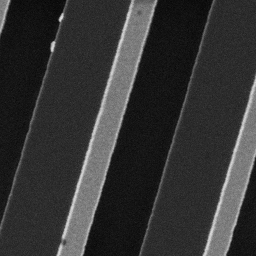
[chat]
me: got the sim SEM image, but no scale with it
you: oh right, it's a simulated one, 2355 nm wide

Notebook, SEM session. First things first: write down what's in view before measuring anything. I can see lines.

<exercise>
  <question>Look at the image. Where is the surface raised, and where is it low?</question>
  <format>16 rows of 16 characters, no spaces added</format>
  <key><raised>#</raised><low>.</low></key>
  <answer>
....######...###
....#####....###
...######....###
...######...####
...######...####
...#####....####
..######...#####
..######...#####
..#####....#####
.######....#####
.######...######
.#####....#####.
.#####....#####.
######...######.
######...######.
#####....#####..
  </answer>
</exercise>